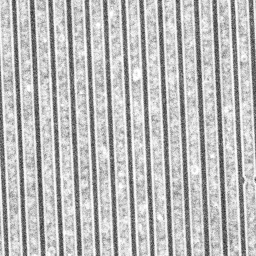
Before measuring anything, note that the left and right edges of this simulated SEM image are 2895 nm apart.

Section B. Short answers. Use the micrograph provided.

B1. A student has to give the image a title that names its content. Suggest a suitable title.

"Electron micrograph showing parallel lines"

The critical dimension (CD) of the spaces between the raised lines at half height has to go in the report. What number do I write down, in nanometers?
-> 65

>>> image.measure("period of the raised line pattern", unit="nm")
206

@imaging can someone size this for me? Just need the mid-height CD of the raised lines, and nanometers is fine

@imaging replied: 140